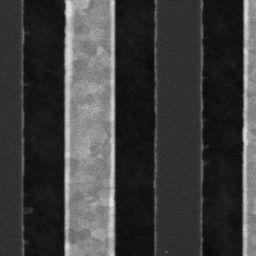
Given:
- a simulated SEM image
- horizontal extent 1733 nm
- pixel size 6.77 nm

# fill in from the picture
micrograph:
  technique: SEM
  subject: lines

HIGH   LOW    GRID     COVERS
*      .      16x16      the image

*...***...***..*
*...***...***..*
*...***...***..*
*...***...***..*
*...***...***..*
*...***...***..*
*...***...***..*
*...***...***..*
*...***...***..*
*...***...***..*
*...***...***..*
*...***...***..*
*...***...***..*
*...***...***..*
*...***...***..*
*...***...***..*